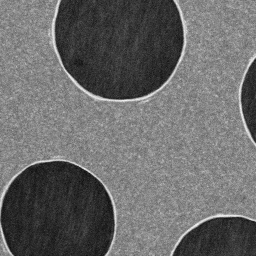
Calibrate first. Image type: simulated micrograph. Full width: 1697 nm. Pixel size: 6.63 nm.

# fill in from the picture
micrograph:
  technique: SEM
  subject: holes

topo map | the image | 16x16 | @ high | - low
@@@@-------@@@@@
@@@--------@@@@@
@@@--------@@@@@
@@@@-------@@@@@
@@@@-------@@@@-
@@@@@-----@@@@@-
@@@@@@@@@@@@@@@-
@@@@@@@@@@@@@@@-
@@@@@@@@@@@@@@@@
@@@@@@@@@@@@@@@@
@@---@@@@@@@@@@@
@-----@@@@@@@@@@
-------@@@@@@@@@
-------@@@@@@@@@
-------@@@@@----
@------@@@@-----